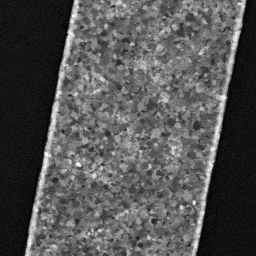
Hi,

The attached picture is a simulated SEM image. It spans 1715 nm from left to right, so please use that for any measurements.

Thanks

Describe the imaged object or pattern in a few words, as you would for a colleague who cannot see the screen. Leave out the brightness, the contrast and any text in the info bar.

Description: one or a few lines or trenches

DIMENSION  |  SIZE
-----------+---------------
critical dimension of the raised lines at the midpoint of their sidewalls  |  1.09 microns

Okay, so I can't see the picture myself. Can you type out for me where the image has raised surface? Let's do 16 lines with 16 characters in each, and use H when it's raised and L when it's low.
LLLLLHHHHHHHHHHL
LLLLHHHHHHHHHHHL
LLLLHHHHHHHHHHHL
LLLLHHHHHHHHHHLL
LLLLHHHHHHHHHHLL
LLLLHHHHHHHHHHLL
LLLLHHHHHHHHHHLL
LLLHHHHHHHHHHHLL
LLLHHHHHHHHHHHLL
LLLHHHHHHHHHHLLL
LLLHHHHHHHHHHLLL
LLLHHHHHHHHHHLLL
LLHHHHHHHHHHHLLL
LLHHHHHHHHHHHLLL
LLHHHHHHHHHHLLLL
LLHHHHHHHHHHLLLL